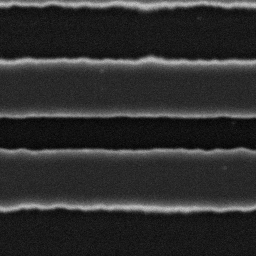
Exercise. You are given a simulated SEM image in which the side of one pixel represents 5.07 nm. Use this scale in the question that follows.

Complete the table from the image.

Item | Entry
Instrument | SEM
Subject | lines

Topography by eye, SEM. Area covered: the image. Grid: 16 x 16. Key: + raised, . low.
................
................
................
................
++++++++++++++++
++++++++++++++++
++++++++++++++++
................
................
++++++++++++++++
++++++++++++++++
++++++++++++++++
++++++++++++++++
................
................
................